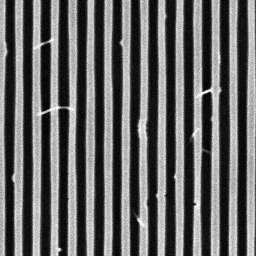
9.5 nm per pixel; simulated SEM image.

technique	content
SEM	parallel lines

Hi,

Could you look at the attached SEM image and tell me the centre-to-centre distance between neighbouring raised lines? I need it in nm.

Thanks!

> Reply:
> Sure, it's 170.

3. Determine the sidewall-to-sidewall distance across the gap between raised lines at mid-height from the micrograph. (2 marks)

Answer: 0.0843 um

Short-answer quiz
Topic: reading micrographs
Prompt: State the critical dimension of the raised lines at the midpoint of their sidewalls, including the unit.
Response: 0.0831 microns